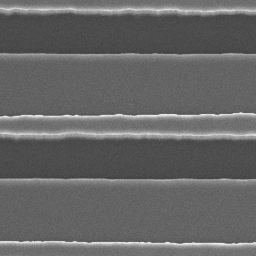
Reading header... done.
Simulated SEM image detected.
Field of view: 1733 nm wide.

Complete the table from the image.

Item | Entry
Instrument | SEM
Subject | lines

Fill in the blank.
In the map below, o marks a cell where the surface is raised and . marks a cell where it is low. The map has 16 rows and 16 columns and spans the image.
oooooooooooooooo
................
................
oooooooooooooooo
oooooooooooooooo
oooooooooooooooo
oooooooooooooooo
oooooooooooooooo
............o.o.
................
................
oooooooooooooooo
oooooooooooooooo
oooooooooooooooo
oooooooooooooooo
oooooooooooooooo